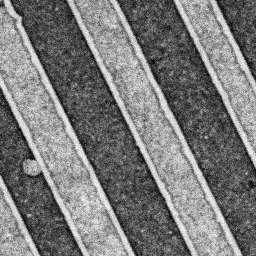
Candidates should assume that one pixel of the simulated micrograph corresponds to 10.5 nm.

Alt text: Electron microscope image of one or a few lines or trenches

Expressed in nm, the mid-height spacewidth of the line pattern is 597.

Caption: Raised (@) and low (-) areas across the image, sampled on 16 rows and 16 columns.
@----@@----@@---
@----@@@----@@--
@@----@@----@@--
@@----@@@----@@-
@@@----@@----@@-
@@@----@@@----@@
-@@@----@@----@@
-@@@----@@@----@
--@@@----@@----@
--@@@----@@@----
---@@@----@@----
---@@@----@@@---
@---@@@----@@---
@---@@@----@@@--
@@---@@@---@@@--
@@---@@@----@@@-